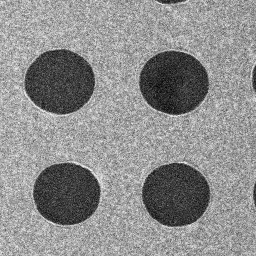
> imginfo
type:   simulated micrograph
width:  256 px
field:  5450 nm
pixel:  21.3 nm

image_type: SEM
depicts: holes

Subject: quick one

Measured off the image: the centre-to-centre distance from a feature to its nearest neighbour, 2360 nm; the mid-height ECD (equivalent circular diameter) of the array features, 1430 nanometres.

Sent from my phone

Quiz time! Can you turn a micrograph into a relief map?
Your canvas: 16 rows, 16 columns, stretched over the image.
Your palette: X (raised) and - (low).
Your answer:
XXXXXXXXXXXXXXXX
XXXXXXXXXXXXXXXX
XXXXXXXXXXXXXXXX
XX---XXXXX--XXXX
XX----XXX----XXX
XX----XXX----XXX
XX---XXXX----XXX
XXXXXXXXXXXXXXXX
XXXXXXXXXXXXXXXX
XXXXXXXXXXXXXXXX
XXX--XXXXX--XXXX
XX----XXX----XXX
XX----XXX----XXX
XXX---XXX----XXX
XXXXXXXXXXXXXXXX
XXXXXXXXXXXXXXXX